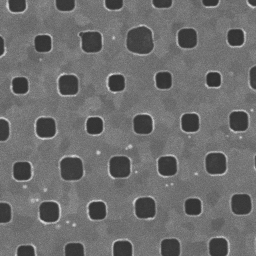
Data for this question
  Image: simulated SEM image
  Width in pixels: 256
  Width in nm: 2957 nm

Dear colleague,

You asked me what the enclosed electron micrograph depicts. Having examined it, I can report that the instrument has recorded a regular array of holes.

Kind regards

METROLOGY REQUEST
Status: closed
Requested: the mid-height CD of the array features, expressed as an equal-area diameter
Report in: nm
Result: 237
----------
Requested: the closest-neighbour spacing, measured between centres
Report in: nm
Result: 553